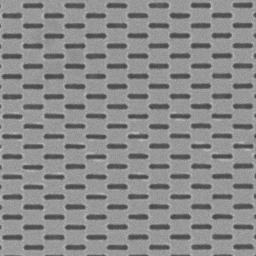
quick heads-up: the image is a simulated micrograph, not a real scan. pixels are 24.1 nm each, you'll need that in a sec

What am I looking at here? a regular array of holes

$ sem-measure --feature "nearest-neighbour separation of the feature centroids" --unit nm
481